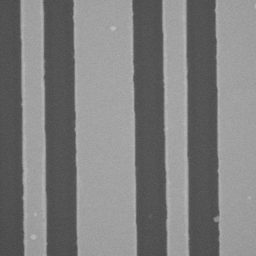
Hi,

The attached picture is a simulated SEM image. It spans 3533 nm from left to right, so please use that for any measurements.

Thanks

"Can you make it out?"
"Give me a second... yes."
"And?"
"lines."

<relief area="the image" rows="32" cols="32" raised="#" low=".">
...##....#######....###....#####
...##....########...###....#####
...##....########...###....#####
...##....########...###....#####
...##....########...###....#####
...##....########...###....#####
...##....########...###....#####
...##....########...###....#####
...###...########...###....#####
...###...########...###....#####
...###...########...###....#####
...###...########....##....#####
...###...########....##....#####
...###...########....##....#####
...###....#######....##....#####
...###....#######....##....#####
...###...########....##....#####
...###....#######....##....#####
...###....#######....##....#####
...###....#######....##....#####
...###....#######....##....#####
...###....#######....##....#####
...###....#######....##....#####
...###....#######....##....#####
...###....#######....##....#####
...###....#######....##....#####
...###....#######....##.....####
...###....#######....##....#####
...###....#######....##....#####
...###....#######....###....####
...###....#######....##.....####
...###....#######....###....####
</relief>